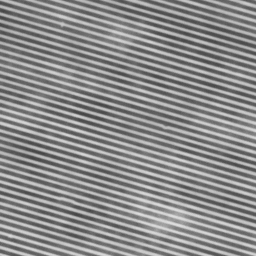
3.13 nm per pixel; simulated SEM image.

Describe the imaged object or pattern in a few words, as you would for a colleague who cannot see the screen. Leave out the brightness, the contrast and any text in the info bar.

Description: parallel lines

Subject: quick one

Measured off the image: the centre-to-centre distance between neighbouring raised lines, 22 nm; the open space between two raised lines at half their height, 12.4 nm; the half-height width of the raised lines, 0.0094 microns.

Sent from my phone